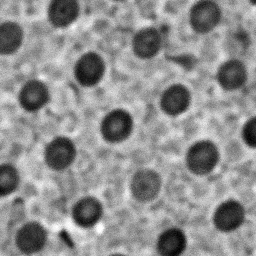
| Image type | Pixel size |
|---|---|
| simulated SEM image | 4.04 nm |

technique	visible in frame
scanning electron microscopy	a regular array of ring-shaped grooves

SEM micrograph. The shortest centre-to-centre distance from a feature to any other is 61.9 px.